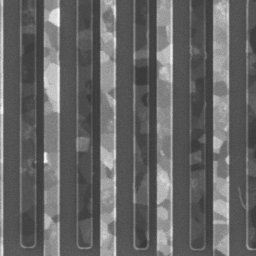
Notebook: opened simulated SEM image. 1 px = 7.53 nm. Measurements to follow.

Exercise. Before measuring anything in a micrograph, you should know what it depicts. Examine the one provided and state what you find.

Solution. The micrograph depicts parallel lines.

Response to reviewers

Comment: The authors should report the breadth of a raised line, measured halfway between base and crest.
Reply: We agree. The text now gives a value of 106 nanometers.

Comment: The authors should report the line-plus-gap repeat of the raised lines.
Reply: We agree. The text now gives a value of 0.207 µm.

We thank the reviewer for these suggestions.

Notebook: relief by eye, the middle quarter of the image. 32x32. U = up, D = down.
DDDDUUUDDUUUUDDDDDUUUDDDUUUDDDDD
DDDDUUUDDUUUUDDDDDUUUDDDUUUDDDDD
DDDDUUUDDUUUUDDDDDUUUDDDUUUDDDDD
DDDDUUUDDUUUUDDDDDUUUDDDUUUDDDDD
DDDDUUUDDUUUUDDDDDUUUDDDUUUDDDDD
DDDDUUUDDUUUUDDDDDUUUDDDUUUDDDDD
DDDDUUUDDUUUUDDDDDUUUDDDUUUDDDDD
DDDDUUUDDUUUUDDDDDUUUDDDUUUDDDDD
DDDDUUUDDUUUUDDDDDUUUDDDUUUDDDDD
DDDDUUUDDUUUUDDDDDUUUDDDUUUDDDDD
DDDDUUUDDUUUUDDDDDUUUDDDUUUDDDDD
DDDDUUUDDUUUUDDDDDUUUDDDUUUDDDDD
DDDDUUUDDUUUUDDDDDUUUDDDUUUDDDDD
DDDDUUUDDUUUUDDDDDUUUDDDUUUDDDDD
DDDDUUUDDUUUUDDDDDUUUDDDUUUDDDDD
DDDDUUUDDUUUUDDDDDUUUDDDUUUDDDDD
DDDDUUUDDUUUUDDDDDUUUDDDUUUDDDDD
DDDDUUUDDUUUUDDDDDUUUDDDUUUDDDDD
DDDDUUUDDUUUUDDDDDUUUDDDUUUDDDDD
DDDDUUUDDUUUUDDDDDUUUDDDUUUDDDDD
DDDDUUUDDUUUUDDDDDUUUDDDUUUDDDDD
DDDDUUUDDUUUUDDDDDUUUDDDUUUDDDDD
DDDDUUUDDUUUUDDDDDUUUDDDUUUDDDDD
DDDDUUUDDUUUUDDDDDUUUDDDUUUDDDDD
DDDDUUUDDUUUUDDDDDUUUDDDUUUDDDDD
DDDDUUUDDUUUUDDDDDUUUDDDUUUDDDDD
DDDDUUUDDUUUUDDDDDUUUDDDUUUDDDDD
DDDDUUUDDUUUUDDDDDUUUDDDUUUDDDDD
DDDDUUUDDUUUUDDDDDUUUDDDUUUDDDDD
DDDDUUUDDUUUUDDDDDUUUDDDUUUDDDDD
DDDDUUUDDUUUUDDDDDUUUDDDUUUDDDDD
DDDDUUUDDUUUUDDDDDUUUDDDUUUDDDDD